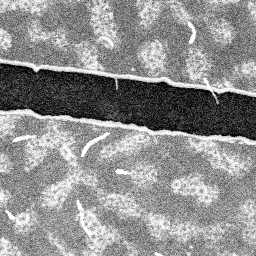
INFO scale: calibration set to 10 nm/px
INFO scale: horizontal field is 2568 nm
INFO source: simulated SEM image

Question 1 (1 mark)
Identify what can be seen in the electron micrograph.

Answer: one or a few lines or trenches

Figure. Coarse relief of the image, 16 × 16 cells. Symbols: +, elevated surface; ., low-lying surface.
++++++++++++++++
++++++++++++++++
++++++++++++++++
++++++++++++++++
......++++++++++
.............+++
................
+++++...........
++++++++++++....
++++++++++++++++
++++++++++++++++
++++++++++++++++
++++++++++++++++
++++++++++++++++
++++++++++++++++
++++++++++++++++